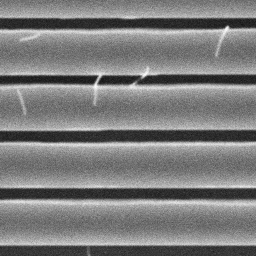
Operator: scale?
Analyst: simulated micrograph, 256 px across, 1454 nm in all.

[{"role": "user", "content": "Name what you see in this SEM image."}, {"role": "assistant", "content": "lines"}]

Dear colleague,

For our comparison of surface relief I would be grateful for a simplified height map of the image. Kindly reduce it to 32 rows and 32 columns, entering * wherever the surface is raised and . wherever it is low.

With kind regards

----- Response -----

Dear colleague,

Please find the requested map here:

********************************
********************************
................................
................................
********************************
********************************
********************************
********************************
********************************
............*...................
................................
********************************
********************************
********************************
********************************
********************************
................................
................................
********************************
********************************
********************************
********************************
********************************
................................
................................
********************************
********************************
********************************
********************************
********************************
********************************
................................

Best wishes